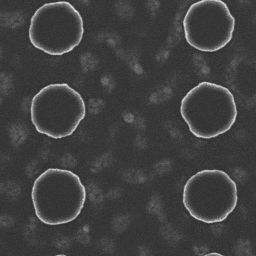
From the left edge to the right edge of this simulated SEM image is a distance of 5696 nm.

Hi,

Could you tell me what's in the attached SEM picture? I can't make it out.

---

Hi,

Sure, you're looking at raised bodies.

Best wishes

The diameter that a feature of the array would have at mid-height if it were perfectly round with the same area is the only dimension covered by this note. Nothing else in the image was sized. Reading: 1180 nm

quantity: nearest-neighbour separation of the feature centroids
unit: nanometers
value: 1910